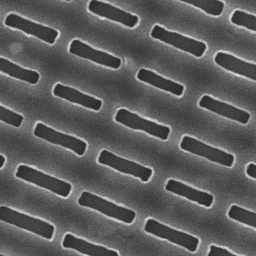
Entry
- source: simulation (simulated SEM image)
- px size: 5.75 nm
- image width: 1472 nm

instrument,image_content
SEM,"a regular array of holes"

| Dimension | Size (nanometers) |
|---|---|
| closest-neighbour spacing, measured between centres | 259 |